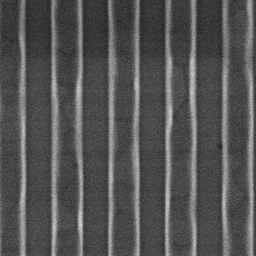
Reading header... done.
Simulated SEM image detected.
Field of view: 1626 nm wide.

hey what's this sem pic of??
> wiring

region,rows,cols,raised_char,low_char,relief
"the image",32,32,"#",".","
###....###....###....###....###.
###....###....###....###....###.
###....###....###....###....###.
###....###....###....###....###.
###....###....###....###....###.
###....###....###....###....###.
###....###....###....###....###.
###....###....###....###....###.
###....###....###....###....###.
###....###....###....###....###.
###....###....###....###....###.
###....###....###....###....###.
###....###....###....###....###.
###....###....###....###....###.
###....###....###....###....###.
###....###....###....###....###.
###....###....###....###....###.
###....###....###....###....###.
###....###....###....###....###.
###....###....###....###....###.
###....###....###....###....###.
###....###....###....###....###.
###....###....###....###....###.
###....###....###....###....###.
###....###....###....###....####
###....###....###....###....####
###....###....###....###....###.
###....###....###....###....###.
###....###....###....###....###.
###....###....###....###....###.
###....###....###....###....###.
###....###....###....###....###.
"